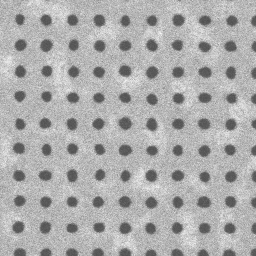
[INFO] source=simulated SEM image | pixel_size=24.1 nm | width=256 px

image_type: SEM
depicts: a regular array of holes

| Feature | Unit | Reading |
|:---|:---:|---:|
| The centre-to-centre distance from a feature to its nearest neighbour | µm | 0.612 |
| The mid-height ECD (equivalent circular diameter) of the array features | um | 0.28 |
